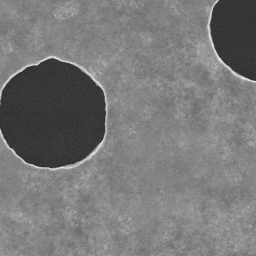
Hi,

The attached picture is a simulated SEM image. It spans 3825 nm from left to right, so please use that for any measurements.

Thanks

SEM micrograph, holes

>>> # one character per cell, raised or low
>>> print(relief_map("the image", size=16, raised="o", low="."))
ooooooooooooo...
ooooooooooooo...
ooooooooooooo...
oooooooooooooo..
o....oooooooooo.
......oooooooooo
.......ooooooooo
.......ooooooooo
......oooooooooo
o.....oooooooooo
oooooooooooooooo
oooooooooooooooo
oooooooooooooooo
oooooooooooooooo
oooooooooooooooo
oooooooooooooooo